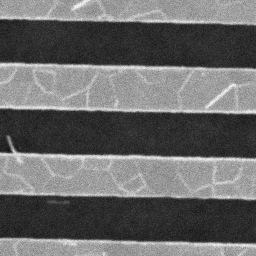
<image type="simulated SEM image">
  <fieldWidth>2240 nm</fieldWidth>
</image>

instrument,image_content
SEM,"lines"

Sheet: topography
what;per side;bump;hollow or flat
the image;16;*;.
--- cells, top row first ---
****************
...............*
................
................
****************
****************
****************
................
................
................
****************
****************
................
................
................
****************